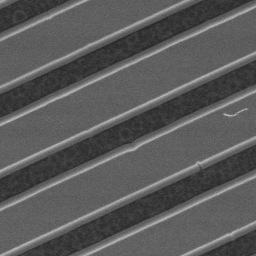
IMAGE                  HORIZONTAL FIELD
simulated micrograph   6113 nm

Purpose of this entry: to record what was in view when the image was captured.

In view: one or a few lines or trenches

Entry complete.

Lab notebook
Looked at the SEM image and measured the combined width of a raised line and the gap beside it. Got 1.84 microns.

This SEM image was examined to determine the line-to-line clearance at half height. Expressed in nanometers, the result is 715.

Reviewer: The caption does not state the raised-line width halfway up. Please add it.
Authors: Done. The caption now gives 1120 nm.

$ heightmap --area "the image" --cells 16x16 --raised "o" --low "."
....ooooooo....o
..ooooooo....ooo
ooooooo....ooooo
ooooo....ooooooo
oo.....ooooooo..
.....ooooooo....
..oooooooo....oo
ooooooo.....oooo
ooooo.....oooooo
ooo....ooooooo..
o....ooooooo....
...ooooooo.....o
.ooooooo....oooo
oooooo....oooooo
oooo....ooooooo.
oo....ooooooo...